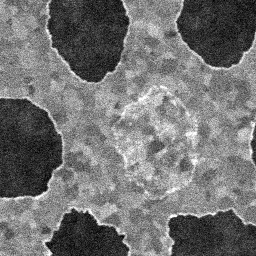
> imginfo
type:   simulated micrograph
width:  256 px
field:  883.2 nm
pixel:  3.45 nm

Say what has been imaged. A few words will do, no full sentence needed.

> holes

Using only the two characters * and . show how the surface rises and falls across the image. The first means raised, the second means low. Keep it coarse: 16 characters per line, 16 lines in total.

***.....***.....
***.....***.....
***.....***.....
****....****...*
*****..*********
****************
..**************
...*************
....************
....************
....************
...*************
****************
****..*****....*
***....****.....
***.....***.....